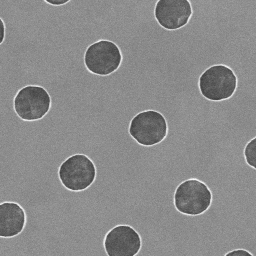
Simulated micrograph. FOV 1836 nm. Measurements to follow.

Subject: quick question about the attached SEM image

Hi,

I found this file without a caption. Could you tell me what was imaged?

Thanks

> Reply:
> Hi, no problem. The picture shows holes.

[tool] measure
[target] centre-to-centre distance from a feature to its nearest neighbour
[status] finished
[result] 594 nanometres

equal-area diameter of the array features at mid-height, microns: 0.254